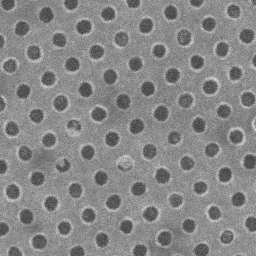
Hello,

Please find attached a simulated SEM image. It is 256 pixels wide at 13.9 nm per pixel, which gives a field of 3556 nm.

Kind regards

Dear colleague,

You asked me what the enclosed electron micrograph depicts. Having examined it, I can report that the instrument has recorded a regular array of holes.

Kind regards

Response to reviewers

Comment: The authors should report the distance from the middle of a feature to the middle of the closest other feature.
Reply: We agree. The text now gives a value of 383 nm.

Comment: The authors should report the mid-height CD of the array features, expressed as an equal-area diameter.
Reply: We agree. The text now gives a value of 216 nanometres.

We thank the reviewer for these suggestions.